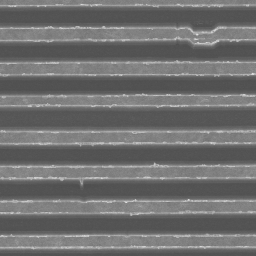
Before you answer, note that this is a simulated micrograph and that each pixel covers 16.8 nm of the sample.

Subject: parallel lines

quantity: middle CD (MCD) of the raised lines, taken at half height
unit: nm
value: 290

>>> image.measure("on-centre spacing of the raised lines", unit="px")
34.6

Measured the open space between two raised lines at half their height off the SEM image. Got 292 nm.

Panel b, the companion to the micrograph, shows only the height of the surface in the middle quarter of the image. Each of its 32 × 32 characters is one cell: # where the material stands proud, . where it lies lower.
################################
################################
################################
................................
................................
................................
................................
.###############################
################################
################################
################################
................................
................................
................................
................................
................................
################################
################################
################################
################################
................................
................................
................................
................................
................................
################################
################################
################################
################################
....#...........................
................................
................................